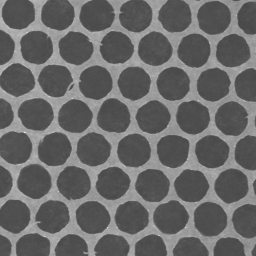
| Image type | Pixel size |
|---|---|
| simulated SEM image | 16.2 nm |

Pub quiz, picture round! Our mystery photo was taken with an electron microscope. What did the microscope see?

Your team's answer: a regular array of holes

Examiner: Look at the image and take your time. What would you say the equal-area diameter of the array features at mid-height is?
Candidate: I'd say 33.5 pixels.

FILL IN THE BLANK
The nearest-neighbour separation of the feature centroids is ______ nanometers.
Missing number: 621